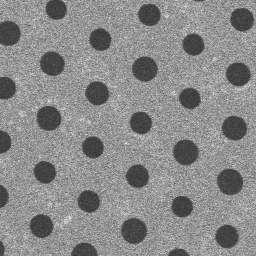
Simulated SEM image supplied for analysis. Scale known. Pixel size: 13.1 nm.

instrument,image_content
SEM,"a regular array of holes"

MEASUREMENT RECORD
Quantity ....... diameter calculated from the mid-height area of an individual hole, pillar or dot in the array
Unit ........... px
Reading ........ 23.5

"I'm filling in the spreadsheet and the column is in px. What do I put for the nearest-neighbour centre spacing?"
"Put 53.3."